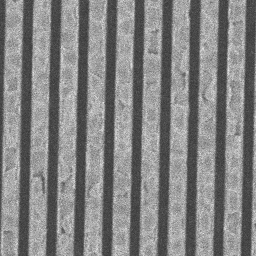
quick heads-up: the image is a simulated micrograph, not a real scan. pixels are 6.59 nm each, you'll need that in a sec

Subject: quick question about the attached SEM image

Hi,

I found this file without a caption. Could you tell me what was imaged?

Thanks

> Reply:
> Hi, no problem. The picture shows parallel lines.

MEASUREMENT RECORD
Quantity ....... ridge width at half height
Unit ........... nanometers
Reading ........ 118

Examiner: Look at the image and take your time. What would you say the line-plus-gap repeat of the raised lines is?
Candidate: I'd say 184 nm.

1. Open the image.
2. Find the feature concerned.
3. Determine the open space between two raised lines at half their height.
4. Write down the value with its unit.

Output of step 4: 68.4 nm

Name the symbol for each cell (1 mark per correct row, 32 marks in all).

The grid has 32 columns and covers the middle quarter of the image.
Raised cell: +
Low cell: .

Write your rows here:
+++...++++...++++...++++...++++.
+++...++++...++++...++++...+.++.
+++...++++...++++...++++...++++.
+++...++++...++++...++++...++++.
+++...++++...++++...++++...++++.
+++...++++...++++...++++...++++.
+++...++++...++++...++++...++++.
+++...++++...++++...++++...++++.
+++...++++...++++...++++...++++.
+++...++++...++++...++++...++++.
+++...++++...++++...++++...++++.
+++...++++...++++...++++...++++.
+++...++++...++++...++++...++++.
+++...++++...++++...++++...++++.
+++...++++...++++...++++...++++.
+++...++++...++++...++++...++++.
+++...++++...++++...++++...++++.
+++...++++...++++...++++...++++.
+++...++++...++++...++++...++++.
+++...++++...++++...++++...++++.
+++...++++...++++...++++...++++.
+++...++++...++++...++++...++++.
+++...++++..+++++...++++...++++.
+++...++++..+++++...++++...++++.
+++...++++..+++++...++++...++++.
+++...++++..+++++..+++++...++++.
+++...++++..+++++..+++++...++++.
+++...++++..+++++..+++++..+++++.
+++...++++..+++++..+++++..+++++.
+++...++++..+++++..+++++..+++++.
+++..+++++..+++++..+++++..+++++.
+++..+++++..+++++..+++++..++++..